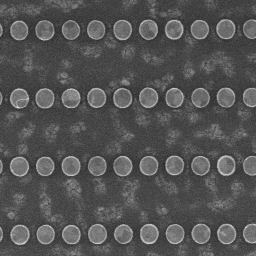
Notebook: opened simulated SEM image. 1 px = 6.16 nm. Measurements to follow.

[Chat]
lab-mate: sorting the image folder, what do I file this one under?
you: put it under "a regular array of raised bodies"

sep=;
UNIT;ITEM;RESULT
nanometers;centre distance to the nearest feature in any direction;158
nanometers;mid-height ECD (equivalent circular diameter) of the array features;116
